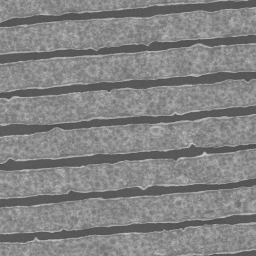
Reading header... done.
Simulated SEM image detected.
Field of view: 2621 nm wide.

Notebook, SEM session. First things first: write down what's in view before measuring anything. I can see parallel lines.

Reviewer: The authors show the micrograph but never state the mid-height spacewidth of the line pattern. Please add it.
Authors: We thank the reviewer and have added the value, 8.72 px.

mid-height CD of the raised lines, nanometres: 281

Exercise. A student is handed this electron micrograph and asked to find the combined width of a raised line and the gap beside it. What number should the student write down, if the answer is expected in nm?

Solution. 368